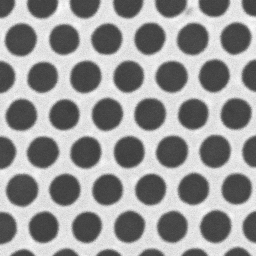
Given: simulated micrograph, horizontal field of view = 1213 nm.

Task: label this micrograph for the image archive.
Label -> a regular array of holes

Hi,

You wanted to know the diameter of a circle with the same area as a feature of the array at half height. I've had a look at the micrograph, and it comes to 151 nm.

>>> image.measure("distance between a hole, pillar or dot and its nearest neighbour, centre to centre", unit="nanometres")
203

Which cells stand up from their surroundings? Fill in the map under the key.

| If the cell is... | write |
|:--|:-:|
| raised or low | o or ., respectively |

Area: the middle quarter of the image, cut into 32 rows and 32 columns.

ooo.....ooooo......ooooo......oo
oo.......oooo.......ooo.......oo
o........ooo........ooo........o
o.........oo........ooo........o
o........ooo........ooo........o
oo.......oooo......ooooo......oo
ooo.....oooooo....ooooooo....ooo
oooooooooooooooooooooooooooooooo
ooooooooooo.ooooooooo.oooooooooo
..oooooo......ooooo.....oooooo..
...ooooo......oooo.......oooo...
....ooo........ooo.......oooo...
....ooo........oo.........oo....
....ooo.......oooo.......oooo...
....ooo.......oooo.......oooo...
...ooooo......ooooo.....oooooo..
.oooooooo...oooooooo..oooooooooo
oooooooooooooooooooooooooooooooo
oooo...ooooooo....ooooooo....ooo
ooo......oooo......ooooo......oo
oo.......oooo.......ooo........o
oo.......ooo........ooo........o
o........ooo........ooo........o
oo.......oooo.......ooo........o
oo.......oooo......ooooo......oo
ooo....ooooooo....ooooooo....ooo
oooooooooooooooooooooooooooooooo
.ooooooooo..ooooooooo..oooooooo.
...oooooo....oooooo......ooooo..
....oooo......oooo.......oooo...
....ooo........ooo........ooo...
....ooo........ooo........oo....